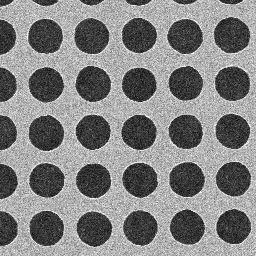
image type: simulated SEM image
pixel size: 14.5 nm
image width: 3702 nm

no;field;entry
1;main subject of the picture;a regular array of holes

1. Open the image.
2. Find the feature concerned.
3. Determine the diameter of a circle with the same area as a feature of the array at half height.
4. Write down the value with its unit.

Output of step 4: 510 nm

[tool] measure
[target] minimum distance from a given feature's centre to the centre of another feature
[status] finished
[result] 0.671 micrometres